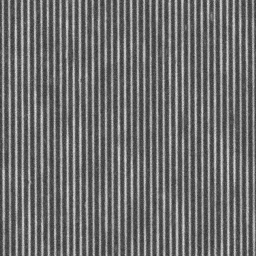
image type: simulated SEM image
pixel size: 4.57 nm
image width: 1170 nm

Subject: parallel lines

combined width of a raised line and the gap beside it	0.0293	µm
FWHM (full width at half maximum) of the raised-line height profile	8	nm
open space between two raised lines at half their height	0.0211	microns